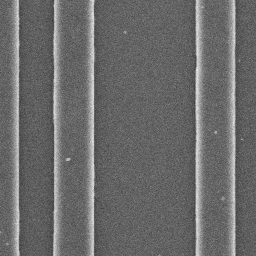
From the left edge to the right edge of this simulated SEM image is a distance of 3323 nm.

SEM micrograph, lines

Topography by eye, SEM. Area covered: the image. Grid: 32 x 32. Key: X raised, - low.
XX-----XXXXX-------------XXXX---
XX-----XXXXX-------------XXXX---
XX-----XXXXX-------------XXXX---
XX-----XXXXX-------------XXXX---
XX-----XXXXX-------------XXXX---
XX-----XXXXX-------------XXXX---
XX-----XXXXX-------------XXXX---
XX-----XXXXX-------------XXXX---
XX-----XXXXX-------------XXXX---
XX-----XXXXX-------------XXXX---
XX-----XXXXX-------------XXXX---
XX-----XXXXX-------------XXXX---
XX-----XXXXX-------------XXXX---
XX-----XXXXX-------------XXXX---
XX-----XXXXX-------------XXXX---
XX-----XXXXX-------------XXXX---
XX-----XXXXX-------------XXXX---
XX-----XXXXX-------------XXXX---
XX-----XXXXX-------------XXXX---
XX-----XXXXX-------------XXXX---
XX-----XXXXX-------------XXXX---
XX-----XXXXX-------------XXXX---
XX-----XXXXX-------------XXXX---
XX-----XXXXX-------------XXXX---
XX-----XXXXX-------------XXXX---
XX-----XXXXX-------------XXXX---
XX-----XXXXX-------------XXXX---
XX-----XXXXX-------------XXXX---
XX-----XXXXX-------------XXXX---
XX-----XXXXX-------------XXXX---
XX-----XXXXX-------------XXXX---
XX-----XXXXX-------------XXXX---